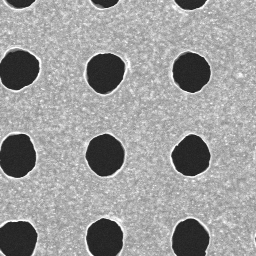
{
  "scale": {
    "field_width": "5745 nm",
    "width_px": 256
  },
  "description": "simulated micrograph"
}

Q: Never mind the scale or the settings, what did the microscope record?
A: holes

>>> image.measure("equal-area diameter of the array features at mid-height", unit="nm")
893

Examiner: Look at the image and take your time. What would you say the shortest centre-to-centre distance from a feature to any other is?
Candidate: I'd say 1870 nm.